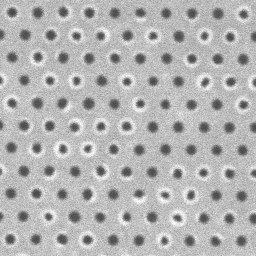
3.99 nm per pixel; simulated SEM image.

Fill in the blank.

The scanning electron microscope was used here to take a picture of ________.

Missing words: a regular array of holes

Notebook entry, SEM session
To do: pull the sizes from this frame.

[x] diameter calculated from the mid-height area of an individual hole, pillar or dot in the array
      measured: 0.0405 um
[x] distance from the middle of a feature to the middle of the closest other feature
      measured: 0.101 microns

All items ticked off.